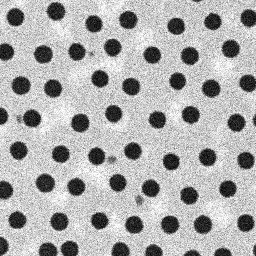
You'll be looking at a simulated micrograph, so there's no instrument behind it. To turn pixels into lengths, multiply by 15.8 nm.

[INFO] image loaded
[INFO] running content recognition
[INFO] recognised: a regular array of holes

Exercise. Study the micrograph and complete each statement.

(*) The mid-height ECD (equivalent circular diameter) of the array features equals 290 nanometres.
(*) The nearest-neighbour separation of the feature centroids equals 524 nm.